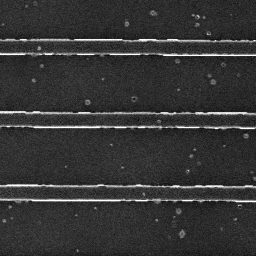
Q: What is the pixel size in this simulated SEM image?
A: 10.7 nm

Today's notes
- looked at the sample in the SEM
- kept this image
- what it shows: lines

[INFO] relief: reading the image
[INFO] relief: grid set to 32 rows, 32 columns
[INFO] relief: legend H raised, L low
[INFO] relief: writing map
LLLLLLLLLLLLLLLLLLLLLLLLLLLLLLLL
LLLLLLLLLLLLLLLLLLLLLLLLLLLLLLLL
LLLLLLLLLLLLLLLLLLLLLLLLLLLLLLLL
LLLLLLLLLLLLLLLLLLLLLLLLLLLLLLLL
LLLLLLLLLLLLLLLLLLLLLLLLLLLLLLLL
HHHHHHHHHHHHHHHHHHHHHHHHHHHHHHHH
HHHHHHHHHHHHHHHHHHHHHHHHHHHHHHHH
LLLLLLLLLLLLLLLLLLLLLLLLLLLLLLLL
LLLLLLLLLLLLLLLLLLLLLLLLLLLLLLLL
LLLLLLLLLLLLLLLLLLLLLLLLLLLLLLLL
LLLLLLLLLLLLLLLLLLLLLLLLLLLLLLLL
LLLLLLLLLLLLLLLLLLLLLLLLLLLLLLLL
LLLLLLLLLLLLLLLLLLLLLLLLLLLLLLLL
LLLLLLLLLLLLLLLLLLLLLLLLLLLLLLLL
HHHHHHHHHHHHHHHHHHHHHHHHHHHHHHHH
HHHHHHHHHHHHHHHHHHHHHHHHHHHHHHHH
LLLLLLLLLLLLLLLLLLLLLLLLLLLLLLLL
LLLLLLLLLLLLLLLLLLLLLLLLLLLLLLLL
LLLLLLLLLLLLLLLLLLLLLLLLLLLLLLLL
LLLLLLLLLLLLLLLLLLLLLLLLLLLLLLLL
LLLLLLLLLLLLLLLLLLLLLLLLLLLLLLLL
LLLLLLLLLLLLLLLLLLLLLLLLLLLLLLLL
LLLLLLLLLLLLLLLLLLLLLLLLLLLLLLLL
HHHHHHHHHHHHHHHHHHHHHHHHHHHHHHHH
HHHHHHHHHHHHHHHHHHHHHHHHHHHHHHHH
LLLLLLLLLLLLLLLLLLLLLLLLLLLLLLLL
LLLLLLLLLLLLLLLLLLLLLLLLLLLLLLLL
LLLLLLLLLLLLLLLLLLLLLLLLLLLLLLLL
LLLLLLLLLLLLLLLLLLLLLLLLLLLLLLLL
LLLLLLLLLLLLLLLLLLLLLLLLLLLLLLLL
LLLLLLLLLLLLLLLLLLLLLLLLLLLLLLLL
LLLLLLLLLLLLLLLLLLLLLLLLLLLLLLLL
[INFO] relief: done